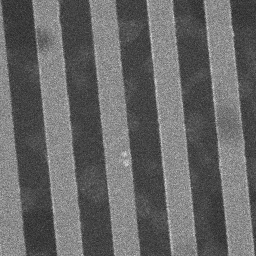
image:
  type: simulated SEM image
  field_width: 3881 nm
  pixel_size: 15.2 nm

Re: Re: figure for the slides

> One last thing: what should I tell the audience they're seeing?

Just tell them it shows parallel lines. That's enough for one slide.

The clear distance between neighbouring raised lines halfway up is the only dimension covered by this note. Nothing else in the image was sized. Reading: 0.487 microns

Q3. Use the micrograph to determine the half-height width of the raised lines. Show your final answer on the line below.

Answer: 375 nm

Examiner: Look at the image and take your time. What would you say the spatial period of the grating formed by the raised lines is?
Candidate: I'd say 862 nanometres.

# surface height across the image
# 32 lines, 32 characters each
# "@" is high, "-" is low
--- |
----@@@----@@@----@@@@----@@@---
----@@@----@@@@----@@@----@@@---
----@@@-----@@@----@@@----@@@---
----@@@@----@@@----@@@----@@@---
@----@@@----@@@----@@@----@@@---
@----@@@----@@@----@@@----@@@---
@----@@@----@@@----@@@----@@@---
@----@@@----@@@----@@@----@@@---
@----@@@----@@@----@@@----@@@---
@----@@@----@@@----@@@-----@@@--
@----@@@----@@@----@@@-----@@@--
@----@@@----@@@-----@@@----@@@--
@----@@@----@@@@----@@@----@@@--
@----@@@@----@@@----@@@----@@@--
@-----@@@----@@@----@@@----@@@--
@@----@@@----@@@----@@@----@@@--
@@----@@@----@@@----@@@----@@@--
@@----@@@----@@@----@@@----@@@--
@@----@@@----@@@----@@@----@@@--
@@----@@@----@@@----@@@----@@@@-
@@----@@@----@@@----@@@-----@@@-
@@----@@@----@@@@----@@@----@@@-
@@----@@@----@@@@----@@@----@@@-
@@----@@@@----@@@----@@@----@@@-
@@-----@@@----@@@----@@@----@@@-
@@@----@@@----@@@----@@@----@@@-
@@@----@@@----@@@----@@@----@@@-
@@@----@@@----@@@----@@@----@@@-
@@@----@@@----@@@----@@@----@@@-
@@@----@@@----@@@----@@@----@@@@
@@@----@@@----@@@----@@@-----@@@
@@@----@@@----@@@-----@@@----@@@